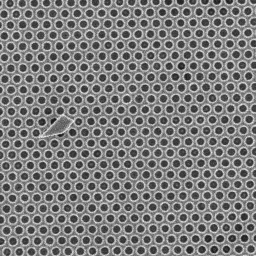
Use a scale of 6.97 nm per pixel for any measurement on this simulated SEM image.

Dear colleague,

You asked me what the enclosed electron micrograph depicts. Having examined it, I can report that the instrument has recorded a regular array of holes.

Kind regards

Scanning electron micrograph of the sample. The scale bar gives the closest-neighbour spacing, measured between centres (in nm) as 83.7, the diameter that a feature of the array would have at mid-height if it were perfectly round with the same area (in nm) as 57.8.